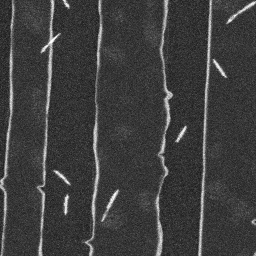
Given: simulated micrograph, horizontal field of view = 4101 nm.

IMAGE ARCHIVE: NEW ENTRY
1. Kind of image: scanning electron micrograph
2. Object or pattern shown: one or a few lines or trenches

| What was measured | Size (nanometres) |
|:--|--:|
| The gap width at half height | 748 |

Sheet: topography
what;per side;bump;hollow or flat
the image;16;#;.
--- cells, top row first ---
.##...####...###
.##...####...###
.##...####...###
.##...####...###
.##...####...###
.##...####...###
.##...####...###
.##...#####..###
###...####...###
###...####...###
###...####...###
###...####...###
###...####...###
###...####...###
###...####...###
###...####..####